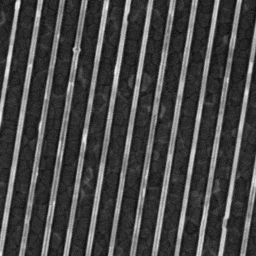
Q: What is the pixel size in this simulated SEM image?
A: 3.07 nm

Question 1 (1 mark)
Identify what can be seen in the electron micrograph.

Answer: parallel lines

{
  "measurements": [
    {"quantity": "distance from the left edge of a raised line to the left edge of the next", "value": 0.0669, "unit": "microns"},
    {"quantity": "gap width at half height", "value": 0.0542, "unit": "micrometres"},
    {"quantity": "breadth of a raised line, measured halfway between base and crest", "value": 14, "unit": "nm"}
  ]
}